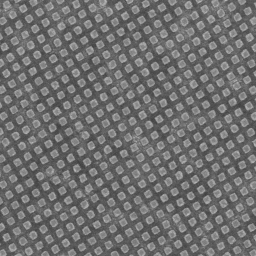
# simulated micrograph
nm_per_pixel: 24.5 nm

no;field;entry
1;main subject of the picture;a regular array of raised bodies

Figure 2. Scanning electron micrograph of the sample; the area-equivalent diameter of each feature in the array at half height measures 179 nm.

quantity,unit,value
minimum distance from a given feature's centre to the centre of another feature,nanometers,286